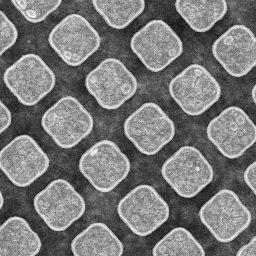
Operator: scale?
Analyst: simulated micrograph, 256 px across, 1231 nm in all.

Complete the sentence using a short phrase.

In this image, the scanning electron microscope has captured a regular array of raised bodies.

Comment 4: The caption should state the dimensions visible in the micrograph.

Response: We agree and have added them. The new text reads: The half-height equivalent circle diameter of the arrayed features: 223 nm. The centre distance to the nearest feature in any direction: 0.278 µm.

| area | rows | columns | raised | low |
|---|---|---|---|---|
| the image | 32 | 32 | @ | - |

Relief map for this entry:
--@@@@@-----@@@@@@----@@@@@@----
---@@@------@@@@@@----@@@@@@----
@---@---@@@--@@@-------@@@@-----
@@-----@@@@@------@@@---@@---@@-
@@----@@@@@@-----@@@@@------@@@@
@@----@@@@@@----@@@@@@@----@@@@@
-------@@@@@-----@@@@@@----@@@@@
--@@@---@@@--@----@@@@-----@@@@@
-@@@@@------@@@@---@----@---@@@-
-@@@@@@----@@@@@@-----@@@@------
-@@@@@@----@@@@@@----@@@@@@-----
--@@@@-----@@@@@@----@@@@@@-----
---@@---@---@@@@------@@@@@-----
@-----@@@@--------@@---@@@------
@----@@@@@@-----@@@@@------@@@@-
@----@@@@@@-----@@@@@@----@@@@@@
------@@@@@-----@@@@@@----@@@@@@
--@@---@@@------@@@@@-----@@@@@@
-@@@@------@@@@--@@@---@---@@@@-
@@@@@@----@@@@@@------@@@---@@--
@@@@@@----@@@@@@-----@@@@@------
-@@@@-----@@@@@@----@@@@@@-----@
-@@@-------@@@@------@@@@@-----@
------@@@---@@---@@---@@@------@
-----@@@@@------@@@@---@---@@@--
----@@@@@@-----@@@@@@-----@@@@--
-----@@@@@-----@@@@@@----@@@@@@-
-@@---@@@------@@@@@@----@@@@@@-
@@@@---@---@@---@@@-------@@@@@-
@@@@@-----@@@@-------@@@---@@---
@@@@@----@@@@@@-----@@@@@------@
@@@@@----@@@@@@----@@@@@@-----@@